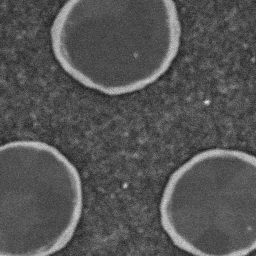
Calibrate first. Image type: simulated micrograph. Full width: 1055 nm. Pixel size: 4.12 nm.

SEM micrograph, raised bodies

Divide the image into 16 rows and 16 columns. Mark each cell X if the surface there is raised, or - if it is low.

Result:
----XXXXXXX-----
----XXXXXXX-----
----XXXXXXX-----
----XXXXXXX-----
-----XXXXX------
------XX--------
----------------
----------------
----------------
XXX-------------
XXXX--------XXXX
XXXXX------XXXXX
XXXXX-----XXXXXX
XXXXX-----XXXXXX
XXXX-------XXXXX
XXX---------XXXX